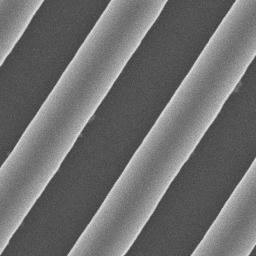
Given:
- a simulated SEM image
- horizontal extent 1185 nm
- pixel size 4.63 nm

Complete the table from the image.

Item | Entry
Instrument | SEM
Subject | lines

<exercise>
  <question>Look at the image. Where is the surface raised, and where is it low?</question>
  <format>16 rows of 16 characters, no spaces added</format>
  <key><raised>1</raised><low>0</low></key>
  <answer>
1100000111000011
1100001111000011
1000011110000111
0000011100001111
0000111100001110
0001111000011110
0001110000111100
0011110000111000
0111100001111000
0111000011110000
1111000011100000
1110000111100001
1100000111000011
1100001110000011
1000011110000111
0000011100001111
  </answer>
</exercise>